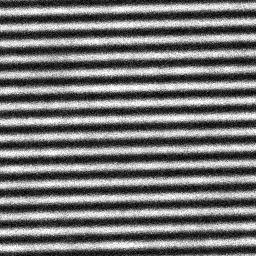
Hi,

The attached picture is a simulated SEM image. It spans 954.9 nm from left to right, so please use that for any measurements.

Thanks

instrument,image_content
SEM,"parallel lines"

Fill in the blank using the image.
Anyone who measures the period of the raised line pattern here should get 0.0587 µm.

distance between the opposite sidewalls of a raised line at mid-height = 22.9 nm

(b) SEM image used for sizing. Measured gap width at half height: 35.5 nm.